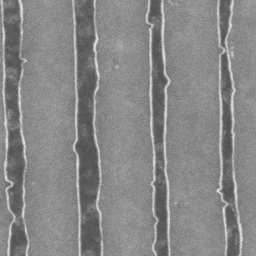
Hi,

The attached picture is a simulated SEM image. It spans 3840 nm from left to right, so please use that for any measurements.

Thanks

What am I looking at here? one or a few lines or trenches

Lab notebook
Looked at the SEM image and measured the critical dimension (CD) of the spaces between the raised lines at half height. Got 814 nm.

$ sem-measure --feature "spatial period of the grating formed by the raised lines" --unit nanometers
1070